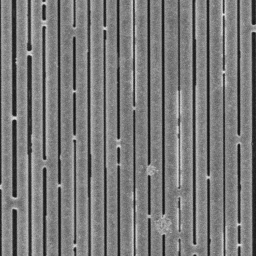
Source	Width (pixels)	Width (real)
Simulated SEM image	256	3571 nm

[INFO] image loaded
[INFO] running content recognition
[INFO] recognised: parallel lines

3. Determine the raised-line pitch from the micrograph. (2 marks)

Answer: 209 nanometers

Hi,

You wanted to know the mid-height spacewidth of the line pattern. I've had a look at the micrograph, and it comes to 2.87 px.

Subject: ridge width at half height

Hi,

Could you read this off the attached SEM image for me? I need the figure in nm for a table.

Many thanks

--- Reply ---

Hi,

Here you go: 160